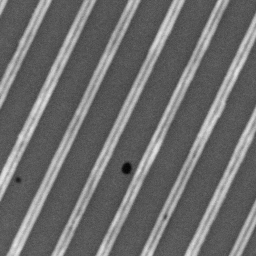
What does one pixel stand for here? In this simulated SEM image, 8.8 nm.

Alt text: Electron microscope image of parallel lines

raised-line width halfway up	70.5	nm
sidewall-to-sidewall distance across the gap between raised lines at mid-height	32	pixels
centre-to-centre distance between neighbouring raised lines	353	nanometres